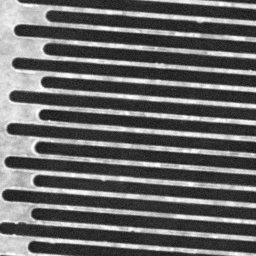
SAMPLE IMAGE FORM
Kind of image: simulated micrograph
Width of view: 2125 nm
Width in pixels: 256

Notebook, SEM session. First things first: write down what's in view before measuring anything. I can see parallel lines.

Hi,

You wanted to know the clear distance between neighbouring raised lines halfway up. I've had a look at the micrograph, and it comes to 107 nm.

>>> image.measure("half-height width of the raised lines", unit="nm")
33.1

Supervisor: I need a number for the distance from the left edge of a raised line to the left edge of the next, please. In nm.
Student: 137